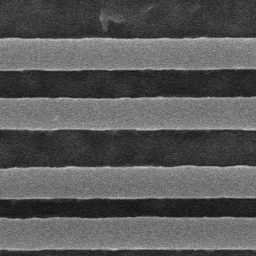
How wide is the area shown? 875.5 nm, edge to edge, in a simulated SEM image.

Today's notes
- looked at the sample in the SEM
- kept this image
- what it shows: lines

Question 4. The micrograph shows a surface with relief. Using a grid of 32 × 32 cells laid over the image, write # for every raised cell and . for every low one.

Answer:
................................
................................
................................
................................
................................
################################
################################
################################
################################
................................
................................
................................
################################
################################
################################
################################
................................
................................
................................
................................
................................
################################
################################
################################
################################
................................
................................
################################
################################
################################
################################
................................